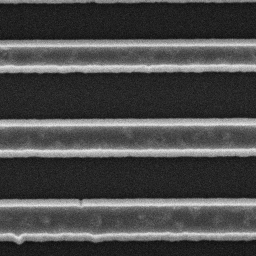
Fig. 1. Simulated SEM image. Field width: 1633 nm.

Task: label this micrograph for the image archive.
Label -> one or a few lines or trenches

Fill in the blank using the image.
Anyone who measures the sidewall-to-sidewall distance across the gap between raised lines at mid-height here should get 316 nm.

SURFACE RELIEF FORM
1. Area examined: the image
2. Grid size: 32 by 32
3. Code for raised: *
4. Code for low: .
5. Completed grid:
................................
................................
................................
................................
................................
.*****.*************************
********************************
********************************
**************************..****
................................
................................
................................
................................
................................
................................
********************************
********************************
********************************
********************************
................................
................................
................................
................................
................................
................................
********************************
********************************
********************************
********************************
********************************
................................
................................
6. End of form